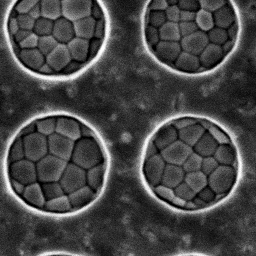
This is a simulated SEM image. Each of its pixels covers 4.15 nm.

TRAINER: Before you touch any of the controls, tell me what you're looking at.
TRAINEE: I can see holes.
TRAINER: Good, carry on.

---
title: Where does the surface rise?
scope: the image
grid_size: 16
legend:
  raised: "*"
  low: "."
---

*.....***......*
.......**......*
*......**......*
*.....****....**
**...******..***
****************
****************
**...******..***
*.....***.....**
.......**......*
.......**......*
*.....***......*
*.....****....**
****************
****************
****************